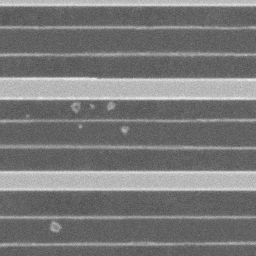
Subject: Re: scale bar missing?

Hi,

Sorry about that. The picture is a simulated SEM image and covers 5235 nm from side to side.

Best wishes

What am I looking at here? lines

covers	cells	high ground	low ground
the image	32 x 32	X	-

XXXXXXXXXXXXXXXXXXXXXXXXXXXXXXXX
--------------------------------
--------------------------------
-------------XX-----------------
XXXXXXXXXXXXXXXXXXXXXXXXXXXXXXXX
XXXXXXXXXXXXXXXXXXXXXXXXXXXXXXXX
XXXXXXXXXXXXXXXXXXXXXXXXXXXXXXXX
--------------------------------
--------------------------------
--------------------------------
XXXXXXXXXXXXXXXXXXXXXXXXXXXXXXXX
XXXXXXXXXXXXXXXXXXXXXXXXXXXXXXXX
--------------------------------
--------------------------------
--------------------------------
XXXXXXXXXXXXXXXXXXXXXXXXXXXXXXXX
XXXXXXXXXXXXXXXXXXXXXXXXXXXXXXXX
XXXXXXXXXXXXXXXXXXXXXXXXXXXXXXXX
--------------------------X-XXXX
--------------------------------
--------------------------------
--------------------------------
XXXXXXXXXXXXXXXXXXXXXXXXXXXXXXXX
XXXXXXXXXXXXXXXXXXXXXXXXXXXXXXXX
--------------------------------
--------------------------------
--------------------------------
XXXXXXXXXXXXXXXXXXXXXXXXXXXXXXXX
XXXXXXXXXXXXXXXXXXXXXXXXXXXXXXXX
XXXXXXXXXXXXXXXXXXXXXXXXXXXXXXXX
XXXXXXXXX-----------------------
--------------------------------